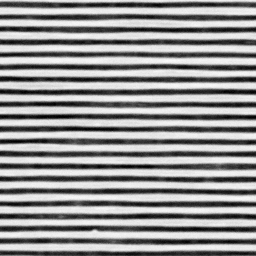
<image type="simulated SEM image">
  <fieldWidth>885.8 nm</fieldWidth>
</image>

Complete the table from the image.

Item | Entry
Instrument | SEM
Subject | parallel lines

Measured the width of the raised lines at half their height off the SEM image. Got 21.6 nm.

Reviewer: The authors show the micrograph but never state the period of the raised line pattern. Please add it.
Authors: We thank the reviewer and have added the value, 12.4 px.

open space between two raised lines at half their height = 21.6 nanometres